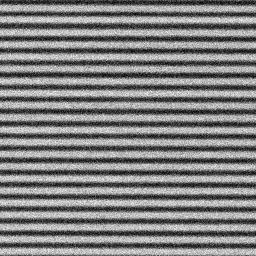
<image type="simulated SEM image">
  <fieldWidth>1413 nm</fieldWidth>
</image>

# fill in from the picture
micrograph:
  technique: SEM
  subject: parallel lines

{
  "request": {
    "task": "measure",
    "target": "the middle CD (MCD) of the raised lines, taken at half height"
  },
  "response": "26.2 nm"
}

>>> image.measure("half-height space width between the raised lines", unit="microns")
0.0421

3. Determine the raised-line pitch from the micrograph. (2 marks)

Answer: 0.0671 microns